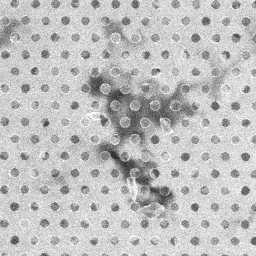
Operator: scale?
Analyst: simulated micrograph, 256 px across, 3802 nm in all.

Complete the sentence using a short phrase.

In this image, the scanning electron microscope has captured a regular array of raised bodies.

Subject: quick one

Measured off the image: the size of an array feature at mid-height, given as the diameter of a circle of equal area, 147 nm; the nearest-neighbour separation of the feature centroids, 289 nanometres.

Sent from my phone